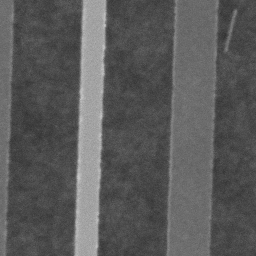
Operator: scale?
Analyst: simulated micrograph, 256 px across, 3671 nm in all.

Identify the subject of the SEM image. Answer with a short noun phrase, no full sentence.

lines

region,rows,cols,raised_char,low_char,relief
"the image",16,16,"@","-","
@----------@@@--
@----------@@@--
@----------@@@--
@----------@@---
@----------@@---
@----------@@---
@----------@@---
@----------@@---
@----------@@---
@----------@@---
-----------@@---
-----------@@---
-----------@@---
-----------@@---
-----------@@---
----------@@@---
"